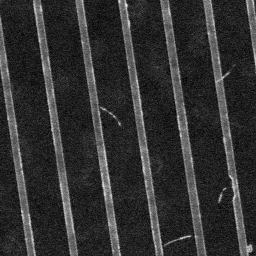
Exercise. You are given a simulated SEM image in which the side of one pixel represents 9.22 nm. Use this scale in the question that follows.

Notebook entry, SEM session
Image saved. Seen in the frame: parallel lines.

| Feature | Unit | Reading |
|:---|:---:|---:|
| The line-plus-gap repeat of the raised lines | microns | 0.389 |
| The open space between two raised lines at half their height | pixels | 34.6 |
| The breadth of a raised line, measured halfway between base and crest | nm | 66.2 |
